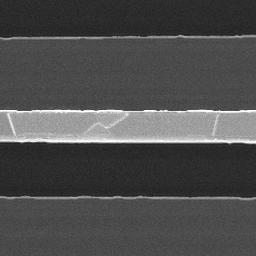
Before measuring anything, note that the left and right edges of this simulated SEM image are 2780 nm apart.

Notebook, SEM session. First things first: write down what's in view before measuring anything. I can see lines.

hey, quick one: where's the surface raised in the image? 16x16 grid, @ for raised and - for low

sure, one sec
----------------
----------------
@@@@@@@@@@@@@@@@
@@@@@@@@@@@@@@@@
@@@@@@@@@@@@@@@@
@@@@@@@@@@@@@@@@
@@@@@@@@@@@@@@@@
@@@@@@@@@@@@@@@@
@@@@@@@@@@@@@@@@
----------------
----------------
----------------
@@@@@@@@@@@@@@@@
@@@@@@@@@@@@@@@@
@@@@@@@@@@@@@@@@
@@@@@@@@@@@@@@@@